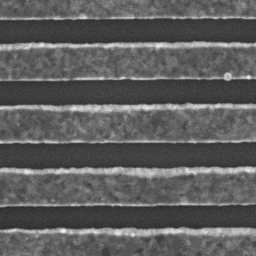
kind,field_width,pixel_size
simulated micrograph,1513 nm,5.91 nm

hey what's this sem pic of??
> lines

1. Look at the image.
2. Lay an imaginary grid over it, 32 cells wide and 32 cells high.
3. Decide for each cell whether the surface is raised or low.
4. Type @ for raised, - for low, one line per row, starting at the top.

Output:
@@@@@@@@@@@@@@@@@@@@@@@@@@@@@@@@
@@@@@@@@@@@@@@@@@@@@@@@@@@@@@@@@
--------------------------------
--------------------------------
--------------------------------
----@@--------@--@@@@-@-@@@@@@@@
@@@@@@@@@@@@@@@@@@@@@@@@@@@@@@@@
@@@@@@@@@@@@@@@@@@@@@@@@@@@@@@@@
@@@@@@@@@@@@@@@@@@@@@@@@@@@@@@@@
@@@@@@@@@@@@@@@@@@@@@@@@@@@@@@@@
--------------------------------
--------------------------------
--------------------------------
@@@@@@@@@@@@@@@@@@@@@@@@@@@@@@@@
@@@@@@@@@@@@@@@@@@@@@@@@@@@@@@@@
@@@@@@@@@@@@@@@@@@@@@@@@@@@@@@@@
@@@@@@@@@@@@@@@@@@@@@@@@@@@@@@@@
@@@@@@@@@@@@@@@@@@@@@@@@@@@@@@@@
--------------------------------
--------------------------------
--------------------------------
@@@@@@@@@@@@@@@@@@@@@@@@@@@@@@@@
@@@@@@@@@@@@@@@@@@@@@@@@@@@@@@@@
@@@@@@@@@@@@@@@@@@@@@@@@@@@@@@@@
@@@@@@@@@@@@@@@@@@@@@@@@@@@@@@@@
@@@@@@@@@@@@@@@@@@@@@@@@@@@@@-@-
--------------------------------
--------------------------------
--------------------------------
@@@@@@@@@@@@@@@@@@@@@@@@@@@@@@@@
@@@@@@@@@@@@@@@@@@@@@@@@@@@@@@@@
@@@@@@@@@@@@@@@@@@@@@@@@@@@@@@@@